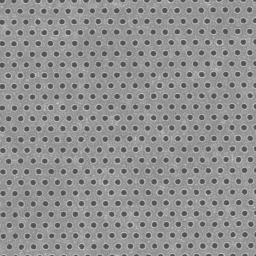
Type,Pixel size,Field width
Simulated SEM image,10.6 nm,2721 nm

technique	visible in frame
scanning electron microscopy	a regular array of holes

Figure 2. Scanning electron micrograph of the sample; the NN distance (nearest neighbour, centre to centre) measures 124 nm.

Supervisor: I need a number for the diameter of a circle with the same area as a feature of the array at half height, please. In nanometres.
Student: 56.3